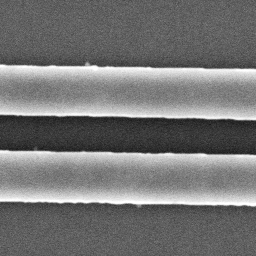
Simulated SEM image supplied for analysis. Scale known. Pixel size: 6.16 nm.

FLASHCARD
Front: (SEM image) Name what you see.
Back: lines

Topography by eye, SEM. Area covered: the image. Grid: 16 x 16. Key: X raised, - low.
----------------
----------------
----------------
----------------
XXXXXXXXXXXXXXXX
XXXXXXXXXXXXXXXX
XXXXXXXXXXXXXXXX
----------------
----------------
XXXX-X----------
XXXXXXXXXXXXXXXX
XXXXXXXXXXXXXXXX
XXXXXXXXXXXXXXXX
----------------
----------------
----------------